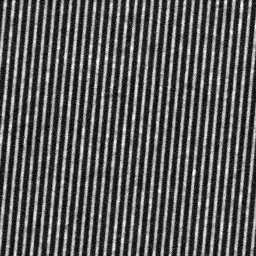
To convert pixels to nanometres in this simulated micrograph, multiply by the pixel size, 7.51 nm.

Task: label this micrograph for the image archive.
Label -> parallel lines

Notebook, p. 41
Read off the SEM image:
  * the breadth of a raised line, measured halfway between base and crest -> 17.7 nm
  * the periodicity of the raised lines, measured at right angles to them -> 61.1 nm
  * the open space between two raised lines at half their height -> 44.8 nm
